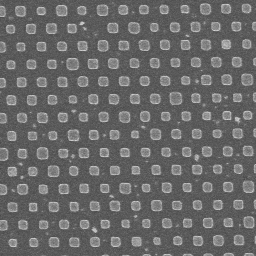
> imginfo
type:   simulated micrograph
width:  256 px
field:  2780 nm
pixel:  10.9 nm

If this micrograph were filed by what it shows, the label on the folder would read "a regular array of raised bodies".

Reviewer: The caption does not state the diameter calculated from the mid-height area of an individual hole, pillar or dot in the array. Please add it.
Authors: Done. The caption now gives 106 nm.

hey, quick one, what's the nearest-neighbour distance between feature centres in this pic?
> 220 nm